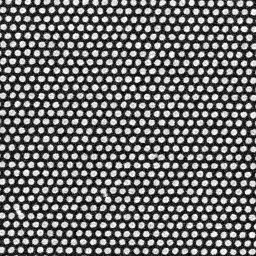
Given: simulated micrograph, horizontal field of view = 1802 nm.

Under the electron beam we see a regular array of raised bodies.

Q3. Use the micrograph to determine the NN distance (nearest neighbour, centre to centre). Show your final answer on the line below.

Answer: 65.7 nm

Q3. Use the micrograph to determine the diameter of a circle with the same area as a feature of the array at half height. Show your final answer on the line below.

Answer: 41.3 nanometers